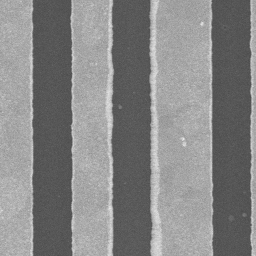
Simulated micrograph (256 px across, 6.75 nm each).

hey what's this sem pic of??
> lines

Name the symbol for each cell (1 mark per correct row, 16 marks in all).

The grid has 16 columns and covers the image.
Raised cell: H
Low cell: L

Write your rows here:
HHLLLHHLLHHHHLLL
HHLLHHHLLHHHHLLL
HHLLLHHLLHHHHLLL
HHLLLHHLLHHHHLLL
HHLLLHHLLHHHHLLL
HHLLLHHLLHHHHLLL
HHLLLHHLLHHHHLLL
HHLLLHHLLLHHHLLL
HHLLLHHLLLHHHLLL
HHLLLHHLLHHHHLLL
HHLLLHHLLLHHHLLL
HHLLLHHLLLHHHLLL
HHLLLHHLLLHHHLLL
HHLLLHHLLLHHHLLL
HHLLLHHLLLHHHLLL
HHLLLHHLLLHHHLLL